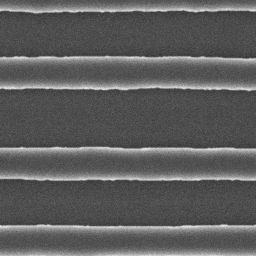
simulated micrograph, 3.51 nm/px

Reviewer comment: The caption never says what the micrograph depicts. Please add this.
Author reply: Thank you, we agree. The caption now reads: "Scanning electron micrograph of lines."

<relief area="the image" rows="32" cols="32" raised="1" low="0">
11111111111111111111111111111111
00001100000000000000000000000000
00000000000000000000000000000000
00000000000000000000000000000000
00000000000000000000000000000000
00000000000000000000000000000000
00000000000000000000000000000000
11111111111111111111111111111111
11111111111111111111111111111111
11111111111111111111111111111111
11111111111111111111111111111111
00000000000000000000000000000000
00000000000000000000000000000000
00000000000000000000000000000000
00000000000000000000000000000000
00000000000000000000000000000000
00000000000000000000000000000000
00000000000000000000000000000000
00000011001111000000000000000000
11111111111111111111111111111111
11111111111111111111111111111111
11111111111111111111111111111111
00000000000000000000000000000000
00000000000000000000000000000000
00000000000000000000000000000000
00000000000000000000000000000000
00000000000000000000000000000000
00000000000000000000000000000000
11111111111111111111111111111111
11111111111111111111111111111111
11111111111111111111111111111111
11111111111111111111111111111111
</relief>